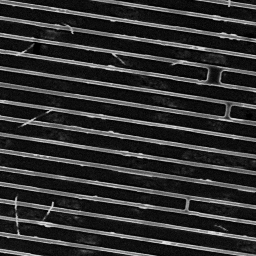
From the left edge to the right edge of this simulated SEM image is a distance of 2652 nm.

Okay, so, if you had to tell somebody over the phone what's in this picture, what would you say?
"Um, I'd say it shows parallel lines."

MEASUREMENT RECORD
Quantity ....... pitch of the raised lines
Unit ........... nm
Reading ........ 170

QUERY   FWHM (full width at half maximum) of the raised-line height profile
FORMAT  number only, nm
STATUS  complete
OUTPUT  35.8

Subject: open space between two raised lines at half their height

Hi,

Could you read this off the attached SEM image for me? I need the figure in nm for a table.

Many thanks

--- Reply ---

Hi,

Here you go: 131